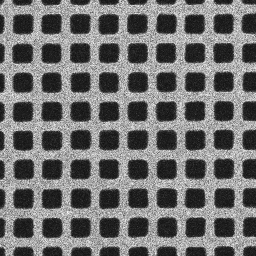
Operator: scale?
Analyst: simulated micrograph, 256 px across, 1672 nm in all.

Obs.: a regular array of holes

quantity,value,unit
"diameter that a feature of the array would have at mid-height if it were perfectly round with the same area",133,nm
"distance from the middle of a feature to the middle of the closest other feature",185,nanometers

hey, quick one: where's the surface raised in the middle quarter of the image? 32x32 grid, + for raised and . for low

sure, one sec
++++++++++++++++++++++++++++++++
++++++++++++++++++++++++++++++++
+++...++++...++++...++++....+++.
++....+++.....++.....++.....++..
++....+++.....++.....++.....++..
++....+++.....++.....++.....++..
++....+++....+++.....+++....+++.
++++++++++++++++++++++++++++++++
++++++++++++++++++++++++++++++++
+++..++++++..++++...++++.+++++++
++....+++.....++.....++.....++..
++.....++.....++.....++.....++..
++....+++.....++.....++.....++..
++....+++.....++.....++.....+++.
++++++++++++++++++++++++++++++++
++++++++++++++++++++++++++++++++
+++++++++++++++++++.++++++++++++
++....+++.....++.....++.....+++.
++.....++.....++.....++.....++..
++.....++.....++.....++.....++..
++.....++.....++.....++.....++..
++++++++++++++++++++++++++++++++
++++++++++++++++++++++++++++++++
++++++++++++++++++++++++++++++++
++....+++....+++....++++....+++.
++.....++.....++.....++.....++..
++.....++.....++.....++.....++..
++.....++.....++.....++.....++..
++....++++...++++...++++....+++.
++++++++++++++++++++++++++++++++
++++++++++++++++++++++++++++++++
++....++++...++++....+++...++++.